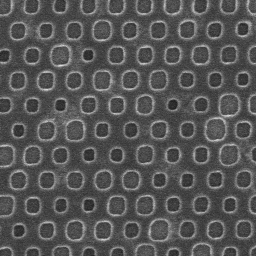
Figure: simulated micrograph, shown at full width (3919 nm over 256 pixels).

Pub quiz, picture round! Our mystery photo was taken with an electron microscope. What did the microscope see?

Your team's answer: a regular array of holes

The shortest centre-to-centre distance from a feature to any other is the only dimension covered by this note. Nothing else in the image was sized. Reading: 0.429 micrometres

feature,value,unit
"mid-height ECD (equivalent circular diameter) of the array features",244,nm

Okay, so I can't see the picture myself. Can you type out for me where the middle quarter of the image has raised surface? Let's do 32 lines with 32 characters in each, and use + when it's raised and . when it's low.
++++++++++++++++++++++++++++++++
++++++++++++++++++++++++++++++++
+...++++...++++...++++....++++..
+...+++.....+++....+++....+++...
+...+++.....+++....+++....+++...
+...++++...++++...++++...++++...
++++++++++++++++++++++++++++++++
++++++++++++++++++++++++++++++++
+++++..++++++.+++++...++++++++++
++++....+++....+++....++++..++++
++++....+++....+++....++++..++++
++++....+++....+++....++++++++++
+++++++++++++++++++..+++++++++++
++++++++++++++++++++++++++++++++
++..+++++++++++++++++++..+++++++
+....+++...++++...++++....+++...
.....+++...++++...++++....+++...
.....+++...++++...++++...++++...
+...+++++.+++++++++++++.++++++++
++++++++++++++++++++++++++++++++
++++++++++++++++++++.+++++++++++
.++++..+++++..++++....++++...+++
.++++...+++....+++....++++...+++
.++++...++++..++++....++++...+++
+++++++++++++.+++++...++++..++++
++++++++++++++++++++++++++++++++
++++++++++++++++++++++++++++++++
+...++++....+++....++++..+++++..
+....+++....+++....+++...++++...
+....+++....+++....+++...++++...
+...++++....+++...+++++..++++...
++++++++++++++++++++++++++++++++